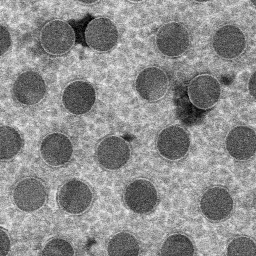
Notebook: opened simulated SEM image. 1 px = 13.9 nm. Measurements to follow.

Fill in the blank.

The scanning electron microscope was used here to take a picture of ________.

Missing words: a regular array of raised bodies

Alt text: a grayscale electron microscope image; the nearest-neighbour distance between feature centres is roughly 698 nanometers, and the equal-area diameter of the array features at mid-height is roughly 482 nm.